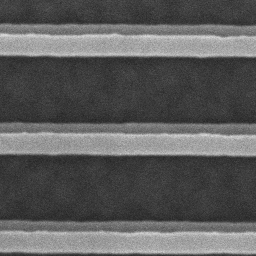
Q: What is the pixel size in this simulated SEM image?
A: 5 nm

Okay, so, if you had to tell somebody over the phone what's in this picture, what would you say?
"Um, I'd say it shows lines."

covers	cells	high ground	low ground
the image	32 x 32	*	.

................................
................................
................................
********************************
********************************
********************************
********************************
................................
................................
................................
................................
................................
................................
................................
................................
*******.........*.*.*...........
********************************
********************************
********************************
................................
................................
................................
................................
................................
................................
................................
................................
................................
********************************
********************************
********************************
.....*....*.********************